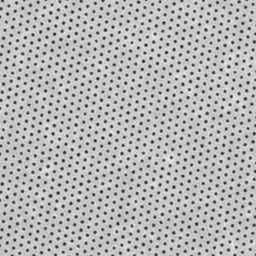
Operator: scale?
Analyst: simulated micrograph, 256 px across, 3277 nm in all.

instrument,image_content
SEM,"a regular array of holes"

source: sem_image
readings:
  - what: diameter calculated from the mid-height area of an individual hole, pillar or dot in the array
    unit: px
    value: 3.57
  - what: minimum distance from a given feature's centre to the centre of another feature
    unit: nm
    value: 102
